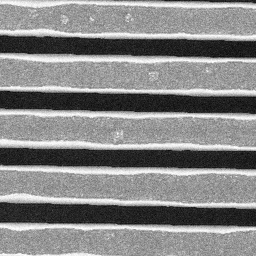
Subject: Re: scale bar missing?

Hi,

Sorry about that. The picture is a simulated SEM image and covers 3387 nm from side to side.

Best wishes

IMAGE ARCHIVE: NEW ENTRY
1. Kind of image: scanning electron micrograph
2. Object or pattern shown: lines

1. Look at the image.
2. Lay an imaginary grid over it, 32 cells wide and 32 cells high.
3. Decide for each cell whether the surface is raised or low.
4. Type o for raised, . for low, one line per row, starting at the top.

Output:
ooooooooooooooooooooooooooooooo.
oooooooooooooooooooooooooooooooo
oooooooooooooooooooooooooooooooo
oooooooooooooooooooooooooooooooo
..........oooooooooooooooooooooo
................................
................................
oooooooooooooooooooooooooooooooo
oooooooooooooooooooooooooooooooo
oooooooooooooooooooooooooooooooo
oooooooooooooooooooooooooooooooo
...................ooooooooooooo
................................
................................
oooooooooooooooooooooooooooooooo
oooooooooooooooooooooooooooooooo
oooooooooooooooooooooooooooooooo
oooooooooooooooooooooooooooooooo
.............ooooooooooooooooooo
................................
................................
oooooooooooooooooooooooooooooooo
oooooooooooooooooooooooooooooooo
oooooooooooooooooooooooooooooooo
oooooooooooooooooooooooooooooooo
...............oo..ooooooooooooo
................................
................................
oooooooooooooooooooooo..........
oooooooooooooooooooooooooooooooo
oooooooooooooooooooooooooooooooo
oooooooooooooooooooooooooooooooo